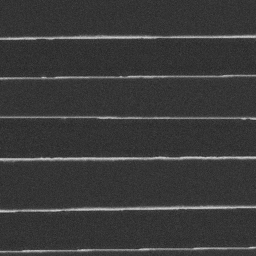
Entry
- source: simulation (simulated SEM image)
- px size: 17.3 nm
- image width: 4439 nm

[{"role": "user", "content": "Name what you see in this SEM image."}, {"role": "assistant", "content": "lines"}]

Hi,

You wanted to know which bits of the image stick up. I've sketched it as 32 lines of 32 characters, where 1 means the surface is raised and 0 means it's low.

11111111111111111111111111111111
11111111111111111111111111111111
11111111111111111111111111111111
11111111111111111111111111111111
11111111111111111111111111111111
00000000000000000000000000000000
00000000000000000000000000000000
00000000000000000000000000000000
00000000000000000000000000000000
00000000000000000000000000011111
11111111111111111111111111111111
11111111111111111111111111111111
11111111111111111111111111111111
11111111111111111111111111111111
11111111111111111111111111111111
00000000000000000000000000000000
00000000000000000000000000000000
00000000000000000000000000000000
00000000000000000000000000000000
00000000000000000000000000000000
11111111111111111111111111111111
11111111111111111111111111111111
11111111111111111111111111111111
11111111111111111111111111111111
11111111111111111111111111111111
11111111111111111111111111111111
00000000000000000000000000000000
00000000000000000000000000000000
00000000000000000000000000000000
00000000000000000000000000000000
00000000000000000000000000000000
11111111111111111111111111111111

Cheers